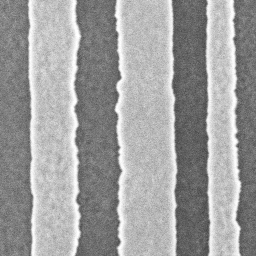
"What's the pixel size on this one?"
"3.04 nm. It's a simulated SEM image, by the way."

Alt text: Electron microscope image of lines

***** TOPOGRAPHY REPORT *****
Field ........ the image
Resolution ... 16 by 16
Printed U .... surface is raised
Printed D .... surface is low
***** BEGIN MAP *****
DDUUUDDUUUUDDUUD
DDUUUDDUUUUDDUUD
DDUUUDDUUUUDDUUD
DDUUUDDUUUUDDUUD
DDUUUDDDUUUDDUUD
DDUUUDDUUUUDDUUD
DDUUUDDUUUUDDUUD
DDUUUDDUUUUDDUUD
DDUUUDDUUUUDDUUD
DDUUUDDDUUUDDUUD
DDUUUDDDUUUDDUUD
DDUUUDDDUUUDDUUD
DDUUUDDUUUUDDUUD
DDUUUDDUUUUDDUUD
DDUUUDDUUUUDDUUD
DDUUUDDUUUUDDUUD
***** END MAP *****